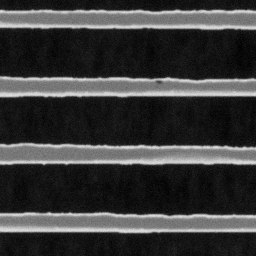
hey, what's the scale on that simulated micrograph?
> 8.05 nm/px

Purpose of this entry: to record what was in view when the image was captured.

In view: lines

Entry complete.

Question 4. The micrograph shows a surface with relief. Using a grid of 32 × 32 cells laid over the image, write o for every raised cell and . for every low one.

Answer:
................................
ooooooooooooooooooo.oooooooooooo
oooooooooooooooooooooooooooooooo
............ooooo....ooooooooooo
................................
................................
................................
................................
................................
................................
oooooooooooooooooooooooooooooooo
oooooooooooooooooooooooooooooooo
................................
................................
................................
................................
................................
................................
ooooooooooooooooooooooooooooo...
oooooooooooooooooooooooooooooooo
................................
................................
................................
................................
................................
................................
................................
oooooooooooooooooooooooooooooooo
oooooooooooooooooooooooooooooooo
................................
................................
................................